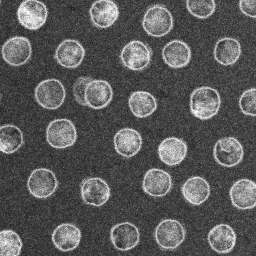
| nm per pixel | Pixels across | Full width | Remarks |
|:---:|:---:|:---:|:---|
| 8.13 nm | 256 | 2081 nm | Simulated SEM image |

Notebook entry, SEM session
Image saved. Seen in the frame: a regular array of holes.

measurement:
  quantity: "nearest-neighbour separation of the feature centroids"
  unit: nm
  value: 364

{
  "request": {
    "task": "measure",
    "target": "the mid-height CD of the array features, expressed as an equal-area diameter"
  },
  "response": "25.8 px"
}